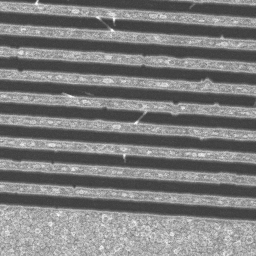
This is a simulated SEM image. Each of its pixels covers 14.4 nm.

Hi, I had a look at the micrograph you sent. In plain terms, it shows parallel lines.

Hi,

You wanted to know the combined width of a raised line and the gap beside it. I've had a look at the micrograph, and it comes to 324 nanometers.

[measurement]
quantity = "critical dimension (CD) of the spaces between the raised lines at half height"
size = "158 nm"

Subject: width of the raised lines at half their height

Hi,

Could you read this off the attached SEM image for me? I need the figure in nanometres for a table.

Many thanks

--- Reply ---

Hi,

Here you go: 170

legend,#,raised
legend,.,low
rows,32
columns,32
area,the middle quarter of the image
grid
.................##..###########
................................
####............................
#####################...........
################################
..........######################
.........................#######
#...............................
##########...#..................
##########################......
################################
..............##################
..........................######
................................
###############...#.............
##############################..
...#############################
...................#############
................................
####............................
####################............
################################
........##.#####################
.........................#######
................................
############....................
##########################......
################################
................################
...............................#
#...............................
#################...............